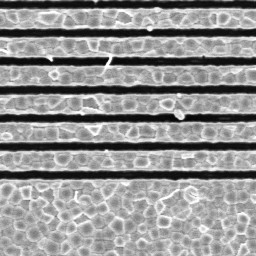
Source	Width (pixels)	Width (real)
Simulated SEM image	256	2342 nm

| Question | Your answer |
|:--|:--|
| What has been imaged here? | parallel lines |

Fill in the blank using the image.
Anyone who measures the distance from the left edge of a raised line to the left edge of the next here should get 260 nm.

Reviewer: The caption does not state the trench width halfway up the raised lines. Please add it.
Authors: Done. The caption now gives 75.5 nm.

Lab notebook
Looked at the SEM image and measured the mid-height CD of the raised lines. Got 186 nanometers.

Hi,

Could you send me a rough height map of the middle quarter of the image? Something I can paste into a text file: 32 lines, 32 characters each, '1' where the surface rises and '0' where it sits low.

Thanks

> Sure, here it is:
00000011111111111111111101111111
11111111111111111111111111111111
11111111111111111111111111111111
11111111111111111111111111111111
11111111111111111111111111111111
00100011000000111000001101000011
00000000000000000000000000000000
00000000110000000000000001111100
11111111111111111111111111111111
11111111111111111111111111111111
11111111111111111111111111111111
11111111111111111111111111111111
11101000000010000000011000011100
00000000000000000000000000001100
00000000000000000000000000000000
11111111111111111111111111111111
11111111111111111111111111111111
11111111111111111111111111111111
11111111111111111111111111111111
01001101110110001110001001111111
00000000000000000000000000000000
00000000000000000000000000000000
11111111111111111111111111111111
11111111111111111111111111111111
11111111111111111111111111111111
11111111111111111111111111111111
11111111111111111111111111111111
00000000000000000000000000000000
00000000000000000000000000000000
11111111111111111111111111111111
11111111111111111111111111111111
11111111111111111111111111111111